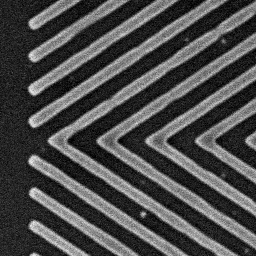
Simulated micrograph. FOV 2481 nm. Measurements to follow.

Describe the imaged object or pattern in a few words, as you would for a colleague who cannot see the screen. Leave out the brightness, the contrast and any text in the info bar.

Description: groups of lines, slits or small figures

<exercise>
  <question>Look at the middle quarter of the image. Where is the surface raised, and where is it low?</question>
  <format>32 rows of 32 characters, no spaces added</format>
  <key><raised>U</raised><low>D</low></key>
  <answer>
UUUUDDDDDDDUUUUUDDDDDDDDUUUUDDDD
UUDDDDDDDDUUUUUDDDDDDDUUUUDDDDDD
UDDDDDDDUUUUUDDDDDDDDUUUUDDDDDDD
DDDDDDDUUUUDDDDDDDDUUUUUDDDDDDDU
DDDDDUUUUUDDDDDDDDUUUUDDDDDDDDUU
DDDDUUUUDDDDDDDDUUUUUDDDDDDDUUUU
DDUUUUUDDDDDDDDUUUUDDDDDDDDUUUUD
DUUUUDDDDDDDDUUUUUDDDDDDDDUUUUDD
UUUUDDDDDDDDUUUUDDDDDDDDUUUUDDDD
UUDDDDDDDDDUUUUDDDDDDDUUUUDDDDDD
UDDDDDDDDUUUUDDDDDDDDUUUUDDDDDDD
DDDDDDDUUUUDDDDDDDDUUUUUDDDDDDDD
DDDDDDUUUUDDDDDDDDUUUUDDDDDDDDUU
DDDDUUUUDDDDDDDDUUUUUDDDDDDDDUUU
DDDUUUUDDDDDDDDUUUUDDDDDDDDUUUUU
DUUUUDDDDDDDDUUUUUDDDDDDDDUUUUDD
UUUDDDDDDDDDUUUUDDDDDDDDUUUUUDDD
UUDDDDDDDDUUUUUDDDDDDDDUUUUDDDDD
UDDDDDDDDUUUUUDDDDDDDUUUUUDDDDDD
DDDDDDDDUUUUUDDDDDDDDUUUUDDDDDDD
UUDDDDDDDDUUUUDDDDDDDDUUUUDDDDDD
UUUDDDDDDDDUUUUUDDDDDDDUUUUUDDDD
UUUUUDDDDDDDDUUUUDDDDDDDDUUUUDDD
DDUUUUDDDDDDDDUUUUUDDDDDDDDUUUUD
DDDUUUUUDDDDDDDUUUUUDDDDDDDDUUUU
DDDDDUUUUDDDDDDDDUUUUUDDDDDDDUUU
DDDDDDUUUUUDDDDDDDUUUUUDDDDDDDDU
DDDDDDDDUUUUDDDDDDDDUUUUDDDDDDDD
UDDDDDDDDDUUUUDDDDDDDDUUUUDDDDDD
UUUDDDDDDDDUUUUDDDDDDDDUUUUDDDDD
UUUUUDDDDDDDUUUUUDDDDDDDDUUUUDDD
DDUUUUDDDDDDDDUUUUDDDDDDDDUUUUUD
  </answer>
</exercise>